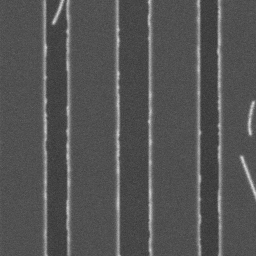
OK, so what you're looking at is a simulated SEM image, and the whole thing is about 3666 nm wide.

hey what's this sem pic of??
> lines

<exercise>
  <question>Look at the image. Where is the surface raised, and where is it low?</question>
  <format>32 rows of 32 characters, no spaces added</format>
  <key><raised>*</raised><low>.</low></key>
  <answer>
******..*******....******..*****
******..*******....******..*****
******..*******....******..*****
******..*******....******..*****
******..*******....******..*****
******..*******....******..*****
******..*******....******..*****
******..*******....******..*****
******..*******....******..*****
******...******....******..*****
******...******....******..*****
******...******....******..*****
******...******....******..*****
******..*******....******..*****
******..*******....******..*****
******...******....******..*****
******..*******....******..*****
******..*******....******..*****
******..*******....******..*****
******..*******....******..*****
******...******....******..*****
******...******....******..*****
******...******....******..*****
******...******....******..*****
******...******....******..*****
******..*******....******..*****
******..*******....******..*****
******..*******....******..*****
******..*******....******..*****
******...******....******..*****
******...******....******..*****
******...******....******..*****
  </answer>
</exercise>